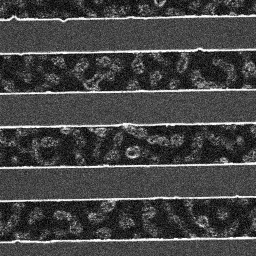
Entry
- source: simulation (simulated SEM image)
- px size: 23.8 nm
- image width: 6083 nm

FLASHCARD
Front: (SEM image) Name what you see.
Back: one or a few lines or trenches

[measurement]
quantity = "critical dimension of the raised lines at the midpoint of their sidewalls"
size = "968 nm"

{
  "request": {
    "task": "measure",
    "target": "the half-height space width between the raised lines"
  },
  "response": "799 nm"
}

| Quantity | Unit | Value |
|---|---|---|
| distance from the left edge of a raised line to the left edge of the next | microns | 1.75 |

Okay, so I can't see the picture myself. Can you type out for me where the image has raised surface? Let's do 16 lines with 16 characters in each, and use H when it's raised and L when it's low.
HHHHHHHHHHHHHHHH
LLLLLLLLLLLLLLLL
LLLLLLLLLLLLLLLL
HHHHHHHHHHHHHHHH
HHHHHHHHHHHHHHHH
HHHHHHHHHHHHHHHH
LLLLLLLLLLLLLLLL
LLLLLLLLLLLLLLLL
HHHHHHHHHHHHHHHH
HHHHHHHHHHHHHHHH
LLLLLLLLLLLLLLLL
LLLLLLLLLLLLLLLL
LLLLLLLHHHHHHHHH
HHHHHHHHHHHHHHHH
HHHHHHHHHHHHHHHH
LLLLLLLLLLLLLLLL